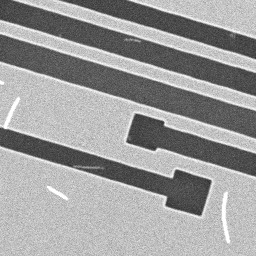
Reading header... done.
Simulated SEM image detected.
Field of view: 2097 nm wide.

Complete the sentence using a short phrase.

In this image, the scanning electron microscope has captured groups of lines, slits or small figures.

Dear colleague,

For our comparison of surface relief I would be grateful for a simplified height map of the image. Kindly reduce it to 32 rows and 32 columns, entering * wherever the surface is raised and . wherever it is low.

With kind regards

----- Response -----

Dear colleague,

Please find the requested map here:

...******.........**************
.......*****.........***********
..........*****.........********
***..........******........*****
.******..........*****.........*
....******..........******......
.......*******.........******...
...........******..........*****
***...........******..........**
******............******........
*********............******.....
*************...........******..
****************...........*****
*******************............*
*****************.*****.........
****************.....*****......
..**************.......******...
......**********..........******
*........*********............**
****........***********.........
*******........************.....
***********........***.*******..
**************............******
*****************.........******
********************......******
*********************.....******
***********************..*******
********************************
********************************
********************************
********************************
********************************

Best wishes